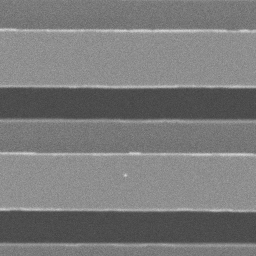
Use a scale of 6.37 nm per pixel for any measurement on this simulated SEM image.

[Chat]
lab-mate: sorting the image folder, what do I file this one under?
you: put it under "lines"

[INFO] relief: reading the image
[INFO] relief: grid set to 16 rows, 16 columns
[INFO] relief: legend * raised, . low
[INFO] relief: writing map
****************
****************
****************
****************
****************
................
................
................
****************
****************
****************
****************
****************
................
................
****************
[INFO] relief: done